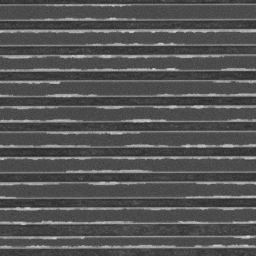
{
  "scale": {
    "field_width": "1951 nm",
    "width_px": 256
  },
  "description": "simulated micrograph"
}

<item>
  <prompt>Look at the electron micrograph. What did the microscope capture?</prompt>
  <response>parallel lines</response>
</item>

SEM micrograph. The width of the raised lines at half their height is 122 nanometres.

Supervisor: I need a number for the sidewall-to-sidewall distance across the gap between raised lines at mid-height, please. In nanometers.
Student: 70.5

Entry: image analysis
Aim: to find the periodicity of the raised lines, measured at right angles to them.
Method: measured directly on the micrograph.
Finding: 195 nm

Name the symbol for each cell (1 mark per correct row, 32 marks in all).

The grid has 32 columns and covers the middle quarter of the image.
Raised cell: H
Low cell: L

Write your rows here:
HHHHHHHHHHHHHHHHHHHHHHHHHHHHHHHH
HHHHHHHHHHHHHHHHHHHHHHHHHHHHHHHH
LLLLLLLLLLLLLLLLLLLLLLLLLLLLLLLL
LLLLLLLLLLLLLLLLLLLLLLLLLLLLLLLL
HHHHHHHHHHHHHHHHHHHHHHHHHHHHHHHH
HHHHHHHHHHHHHHHHHHHHHHHHHHHHHHHH
HHHHHHHHHHHHHHHHHHHHHHHHHHHHHHHH
HHHHHHHHHHHHHHHHHHHHHHHHHHHHHHHH
LLLLLLLLLLLLLLLLLLLLLLLLLLLLLLLL
LLLLLLLLLLLLLLLLLLLLLLLLLLLLLLLL
LLLLLLLLLLLLLLLLLLLLLLLLLLHHLLLL
HHHHHHHHHHHHHHHHHHHHHHHHHHHHHHHH
HHHHHHHHHHHHHHHHHHHHHHHHHHHHHHHH
HHHHHHHHHHHHHHHHHHHHHHHHHHHHHHHH
HHHLLLLLLLLLLLLLLLLLLLLLLLLLLLLL
LLLLLLLLLLLLLLLLLLLLLLLLLLLLLLLL
LLLLLLLLLLLLLLLLLLLLLLLLLLLLLLLL
HHHHHHHHHHHHHHHHHHHHHHHHHHHHHHHH
HHHHHHHHHHHHHHHHHHHHHHHHHHHHHHHH
HHHHHHHHHHHHHHHHHHHHHHHHHHHHHHHH
HHHHHHHHHHHHHHHHHHHHHHHHHHHHHHHH
LLLLLLLLLLLLLLLLLLLLLLLLLLLLLLLL
LLLLLLLLLLLLLLLLLLLLLLLLLLLLLLLL
HHHHHHHHHHHHHHHHHHHHHHHHHHHHHHHH
HHHHHHHHHHHHHHHHHHHHHHHHHHHHHHHH
HHHHHHHHHHHHHHHHHHHHHHHHHHHHHHHH
HHHHHHHHHHHHHHHHHHHHHHHHHHHHHHHH
LLLLLLLLLLLLLLLLLLLLLLLLLLLLLLLL
LLLLLLLLLLLLLLLLLLLLLLLLLLLLLLLL
LLLLLLLLLLLLLLLLLLLLLLLLLLLLLLLL
HHHHHHHHHHHHHHHHHHHHHHHHHHHHHHHH
HHHHHHHHHHHHHHHHHHHHHHHHHHHHHHHH